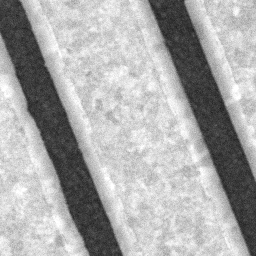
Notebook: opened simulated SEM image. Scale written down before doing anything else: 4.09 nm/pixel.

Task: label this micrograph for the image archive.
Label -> one or a few lines or trenches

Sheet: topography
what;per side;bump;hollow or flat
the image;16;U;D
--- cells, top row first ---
DDUUUUUUUDDDUUUU
DDUUUUUUUDDDDUUU
DDDUUUUUUUDDDUUU
DDDUUUUUUUDDDUUU
DDDDUUUUUUUDDDUU
UDDDUUUUUUUDDDUU
UDDDUUUUUUUDDDUU
UUDDDUUUUUUUDDDU
UUDDDUUUUUUUDDDU
UUUDDDUUUUUUUDDD
UUUDDDUUUUUUUDDD
UUUDDDUUUUUUUDDD
UUUUDDDUUUUUUUDD
UUUUDDDUUUUUUUDD
UUUUDDDDUUUUUUUD
UUUUUDDDUUUUUUUD